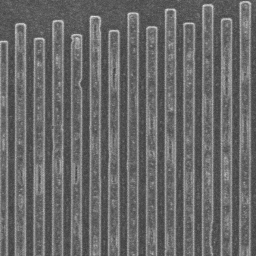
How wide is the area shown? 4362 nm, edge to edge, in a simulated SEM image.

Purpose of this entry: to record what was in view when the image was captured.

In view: parallel lines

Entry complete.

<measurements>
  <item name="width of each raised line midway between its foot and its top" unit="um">0.168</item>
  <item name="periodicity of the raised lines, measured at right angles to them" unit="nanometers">319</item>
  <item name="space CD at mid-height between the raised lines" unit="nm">151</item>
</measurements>